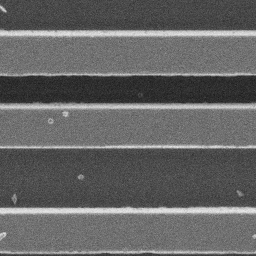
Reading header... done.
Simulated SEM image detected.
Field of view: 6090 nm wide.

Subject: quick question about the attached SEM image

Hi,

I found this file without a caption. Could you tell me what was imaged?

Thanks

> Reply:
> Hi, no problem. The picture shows lines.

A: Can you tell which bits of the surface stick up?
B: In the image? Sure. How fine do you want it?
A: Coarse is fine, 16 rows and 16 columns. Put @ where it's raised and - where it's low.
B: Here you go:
----------------
----------------
@@@@@@@@@@@@@@@@
@@@@@@@@@@@@@@@@
@@@@@@@@@@@@@@@@
----------------
----------------
@@@@@@@@@@@@@@@@
@@@@@@@@@@@@@@@@
----------------
----------------
----------------
----------------
@@@@@@@@@@@@@@@@
@@@@@@@@@@@@@@@@
@@@@@@@@@@@@@@@@